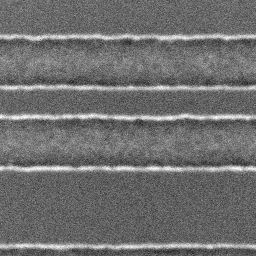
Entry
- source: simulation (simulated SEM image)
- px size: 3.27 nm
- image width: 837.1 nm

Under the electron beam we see lines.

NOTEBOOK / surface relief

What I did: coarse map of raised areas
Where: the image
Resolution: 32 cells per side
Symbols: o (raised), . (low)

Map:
oooooooooooooooooooooooooooooooo
oooooooooooooooooooooooooooooooo
oooooooooooooooooooooooooooooooo
oooooooooooooooooooooooooooooooo
oooooooooooooooooooooooooooooooo
................................
................................
................................
................................
................................
................................
oooooooooooooooooooooooooooooooo
oooooooooooooooooooooooooooooooo
oooooooooooooooooooooooooooooooo
oooooooooooooooooooooooooooooooo
................................
................................
................................
................................
................................
................................
oooooooooooooooooooooooooooooooo
oooooooooooooooooooooooooooooooo
oooooooooooooooooooooooooooooooo
oooooooooooooooooooooooooooooooo
oooooooooooooooooooooooooooooooo
oooooooooooooooooooooooooooooooo
oooooooooooooooooooooooooooooooo
oooooooooooooooooooooooooooooooo
oooooooooooooooooooooooooooooooo
oooooooooooooooooooooooooooooooo
................................